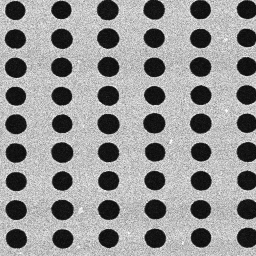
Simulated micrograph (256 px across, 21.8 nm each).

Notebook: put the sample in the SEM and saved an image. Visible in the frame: a regular array of holes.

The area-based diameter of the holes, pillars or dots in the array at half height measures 447 nm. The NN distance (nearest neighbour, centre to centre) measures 619 nm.